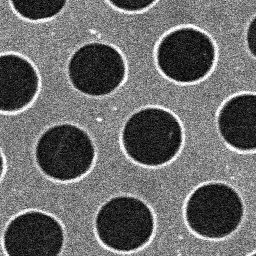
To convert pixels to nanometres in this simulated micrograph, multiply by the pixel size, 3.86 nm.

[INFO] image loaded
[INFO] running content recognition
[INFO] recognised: holes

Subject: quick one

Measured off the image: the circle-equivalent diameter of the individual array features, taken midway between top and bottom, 212 nanometers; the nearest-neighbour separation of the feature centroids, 341 nanometres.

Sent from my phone